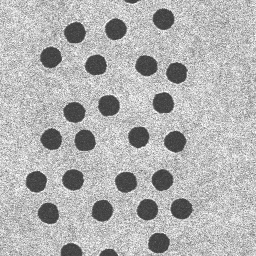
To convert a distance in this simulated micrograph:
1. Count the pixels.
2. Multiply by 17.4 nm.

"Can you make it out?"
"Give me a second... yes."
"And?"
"a regular array of holes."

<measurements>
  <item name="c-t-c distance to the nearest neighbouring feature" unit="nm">602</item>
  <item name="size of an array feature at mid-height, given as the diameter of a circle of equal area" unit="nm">378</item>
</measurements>